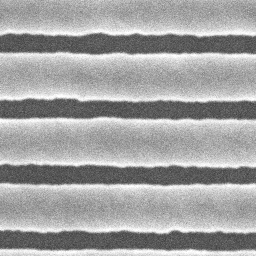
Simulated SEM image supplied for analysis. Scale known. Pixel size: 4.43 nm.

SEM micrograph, lines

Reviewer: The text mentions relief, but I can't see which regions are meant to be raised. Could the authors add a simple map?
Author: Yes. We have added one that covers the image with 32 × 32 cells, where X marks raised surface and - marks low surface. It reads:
XXXXXXXXXXXXXXXXXXXXXXXXXXXXXXXX
XXXXXXXXXXXXXXXXXXXXXXXXXXXXXXXX
XXXXXXXXXXXXXXXXXXXXXXXXXXXXXXXX
XXXXXXXXXXXXXXXXXXXXXXXXXXXXXXXX
--------------------------------
--------------------------------
--------------------------------
XXXXXXXXXXXXXXXXXXXXXXXXXXXXXXXX
XXXXXXXXXXXXXXXXXXXXXXXXXXXXXXXX
XXXXXXXXXXXXXXXXXXXXXXXXXXXXXXXX
XXXXXXXXXXXXXXXXXXXXXXXXXXXXXXXX
XXXXXXXXXXXXXXXXXXXXXXXXXXXXXXXX
----------X--XXXXXXX-XXXXXXXXXXX
--------------------------------
--------------------------------
XXXXXXXXXXXXXXXXXXXXXXXXXXXXXXXX
XXXXXXXXXXXXXXXXXXXXXXXXXXXXXXXX
XXXXXXXXXXXXXXXXXXXXXXXXXXXXXXXX
XXXXXXXXXXXXXXXXXXXXXXXXXXXXXXXX
XXXXXXXXXXXXXXXXXXXXXXXXXXXXXXXX
-XX--XXXXXX-XXXXXXXXXXXXXXXXXXXX
--------------------------------
--------------------------------
XXXXXXXXXXXXXXXXXXXXXXXXXXXXXXXX
XXXXXXXXXXXXXXXXXXXXXXXXXXXXXXXX
XXXXXXXXXXXXXXXXXXXXXXXXXXXXXXXX
XXXXXXXXXXXXXXXXXXXXXXXXXXXXXXXX
XXXXXXXXXXXXXXXXXXXXXXXXXXXXXXXX
XXXXXXXXXXXXXXXXXXXXXXXXXXXXXXXX
--------------------------------
--------------------------------
XXXXXXXXXXXXXXXXXXXXXXXXXXXXXXXX